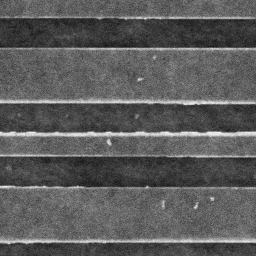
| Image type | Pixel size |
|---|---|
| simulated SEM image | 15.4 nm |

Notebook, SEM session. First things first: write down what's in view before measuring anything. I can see lines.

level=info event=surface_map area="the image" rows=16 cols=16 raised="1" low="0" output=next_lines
1111111111111111
0000000000000000
0000000000000000
1111111111111111
1111111111111111
1111111111111111
0000000000000000
0000000000000000
1111111111111111
1111111111111111
0000000000000000
0000000000000000
1111111111111111
1111111111111111
1111111111111111
0000000000000000